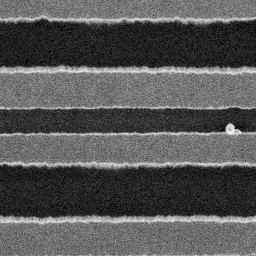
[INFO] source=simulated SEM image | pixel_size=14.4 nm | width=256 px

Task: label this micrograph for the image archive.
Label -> lines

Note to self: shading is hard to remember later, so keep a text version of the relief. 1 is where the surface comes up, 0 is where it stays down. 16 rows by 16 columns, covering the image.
1111111111111111
0000000000000000
0000000000000000
0000000000000000
1111111111111111
1111111111111111
1111111111111111
1111111111111111
1111111111111111
1111111111111111
0000000000000000
0000000000000000
0000000000000000
0000000000000000
1111111111111111
1111111111111111